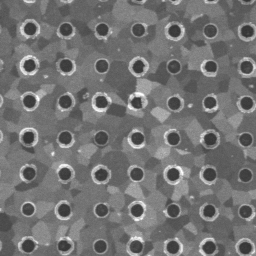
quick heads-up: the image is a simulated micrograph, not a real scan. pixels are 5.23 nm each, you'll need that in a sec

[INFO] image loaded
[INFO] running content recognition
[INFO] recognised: a regular array of holes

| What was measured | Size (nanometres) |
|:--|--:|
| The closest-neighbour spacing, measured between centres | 186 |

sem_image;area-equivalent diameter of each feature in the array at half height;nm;71.6